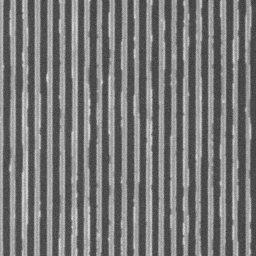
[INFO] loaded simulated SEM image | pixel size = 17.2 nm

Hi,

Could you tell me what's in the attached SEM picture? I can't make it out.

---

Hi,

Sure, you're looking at parallel lines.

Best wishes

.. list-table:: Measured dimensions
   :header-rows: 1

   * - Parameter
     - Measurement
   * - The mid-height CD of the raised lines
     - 0.0665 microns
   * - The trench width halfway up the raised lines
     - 142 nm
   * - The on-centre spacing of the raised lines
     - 213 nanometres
